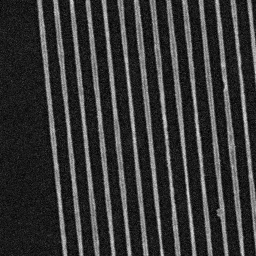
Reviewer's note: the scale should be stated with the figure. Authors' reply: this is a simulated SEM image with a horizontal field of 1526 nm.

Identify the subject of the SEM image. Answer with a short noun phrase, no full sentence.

parallel lines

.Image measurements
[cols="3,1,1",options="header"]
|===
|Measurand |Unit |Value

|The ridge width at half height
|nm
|20.7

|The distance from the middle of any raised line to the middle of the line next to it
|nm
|95.6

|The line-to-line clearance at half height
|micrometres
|0.0778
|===